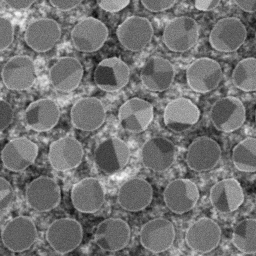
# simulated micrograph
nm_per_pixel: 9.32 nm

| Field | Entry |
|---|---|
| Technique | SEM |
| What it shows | a regular array of raised bodies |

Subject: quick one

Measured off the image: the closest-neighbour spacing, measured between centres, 0.422 um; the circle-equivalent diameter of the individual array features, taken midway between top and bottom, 322 nm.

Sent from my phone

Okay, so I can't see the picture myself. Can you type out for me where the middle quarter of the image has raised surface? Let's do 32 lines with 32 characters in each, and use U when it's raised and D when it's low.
UUUUDDDDUUUUUUUUDDDDUUUUUUUDDDDD
UUUUUDDDUUUUUUUUDDDUUUUUUUUUDDDU
UUUUUDDDUUUUUUUUDDDUUUUUUUUUDDDU
UUUUDDDDUUUUUUUUDDDUUUUUUUUDDDDU
UUUUDDDDUUUUUUUUDDDDUUUUUUUDDDDU
UUUDDDDDDUUUUUUDDDDDUUUUUUDDDDDU
UUDDDDDDDDUUUUDDDDDDDDUUUDDDDDDD
DDDDDDDDDDDDDDDDDDDDDDDDDDDDDDDD
DDDDDDDUDDDDDDDDDDDDDDDDDDDDDUDD
DDDUUUUUUDDDDDDUUUUUUDDDDDDUUUUU
DDUUUUUUUUDDDDUUUUUUUUDDDDUUUUUU
DDUUUUUUUUDDDDUUUUUUUUDDDUUUUUUU
DDUUUUUUUUDDDDUUUUUUUUDDDUUUUUUU
DDUUUUUUUUDDDDUUUUUUUUDDDUUUUUUU
DDUUUUUUUUDDDDUUUUUUUUDDDUUUUUUU
DDUUUUUUUDDDDDUUUUUUUDDDDDUUUUUU
DDDDDUUDDDDDDDDDUUUUDDDDDDDUUUUD
DDDDDDDDDDDDDDDDDDDDDDDDDDDDDDDD
UUUDDDDDDDDDUUDDDDDDDUUUUDDDDDDD
UUUUDDDDDUUUUUUDDDDDUUUUUUUDDDDD
UUUUDDDDDUUUUUUUDDDDUUUUUUUDDDDU
UUUUUDDDUUUUUUUUDDDUUUUUUUUUDDDU
UUUUUDDDUUUUUUUUDDDUUUUUUUUUDDDU
UUUUDDDDUUUUUUUUDDDUUUUUUUUDDDDU
UUUUDDDDUUUUUUUUDDDDUUUUUUUDDDDU
UUUDDDDDUUUUUUUDDDDDUUUUUUUDDDDU
UDDDDDDDDUUUUUDDDDDDDDUUUUDDDDDD
DDDDDDDDDDDUDDDDDDDDDDDDDDDDDDDD
DDDDDDUDDDDDDDDDDUUDDDDDDDDDDDDD
DDDDUUUUUDDDDDDUUUUUUDDDDDDUUUUU
DDDUUUUUUUDDDDUUUUUUUUDDDDUUUUUU
DDUUUUUUUUDDDDUUUUUUUUDDDUUUUUUU